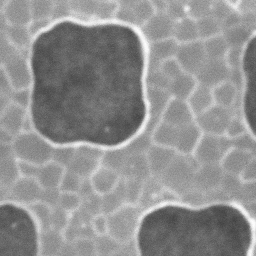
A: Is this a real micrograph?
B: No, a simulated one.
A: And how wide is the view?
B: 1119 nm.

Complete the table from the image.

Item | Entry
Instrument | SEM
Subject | holes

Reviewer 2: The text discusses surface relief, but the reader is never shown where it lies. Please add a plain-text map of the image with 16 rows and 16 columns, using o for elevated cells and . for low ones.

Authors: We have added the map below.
oooooooooooooooo
oooo.o.ooooooooo
oo.......ooooooo
oo.......oooooo.
oo.......oooooo.
oo.......oooooo.
oo.......oooooo.
oo.......oooooo.
ooo.....oooooooo
oooooooooooooooo
oooooooooooooooo
oooooooooooooooo
oooooooooooooooo
..ooooooo......o
..ooooooo.......
..ooooooo.......